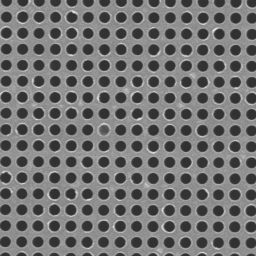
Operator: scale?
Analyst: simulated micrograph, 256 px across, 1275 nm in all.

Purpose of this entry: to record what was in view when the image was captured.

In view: a regular array of holes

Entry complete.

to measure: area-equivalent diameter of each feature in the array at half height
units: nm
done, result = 54.4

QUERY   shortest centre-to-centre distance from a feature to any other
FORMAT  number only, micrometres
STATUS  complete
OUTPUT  0.0794